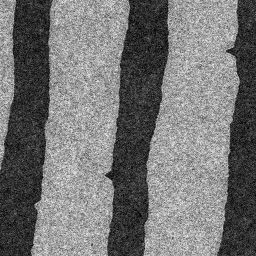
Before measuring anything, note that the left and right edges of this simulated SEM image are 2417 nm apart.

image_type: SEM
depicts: one or a few lines or trenches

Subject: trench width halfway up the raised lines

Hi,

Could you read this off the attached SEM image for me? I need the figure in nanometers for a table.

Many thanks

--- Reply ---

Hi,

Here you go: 357